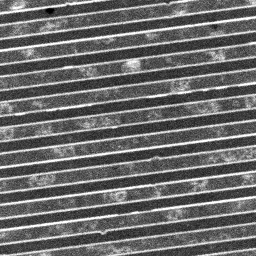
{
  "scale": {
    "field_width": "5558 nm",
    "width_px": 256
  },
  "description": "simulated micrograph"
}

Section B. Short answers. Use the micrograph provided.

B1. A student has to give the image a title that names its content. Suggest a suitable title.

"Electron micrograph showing parallel lines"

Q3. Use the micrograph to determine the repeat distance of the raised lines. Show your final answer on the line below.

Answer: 553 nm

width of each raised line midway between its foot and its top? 304 nanometers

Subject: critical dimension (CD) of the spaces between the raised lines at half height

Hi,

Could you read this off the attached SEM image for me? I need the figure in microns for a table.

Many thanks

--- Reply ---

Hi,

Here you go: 0.248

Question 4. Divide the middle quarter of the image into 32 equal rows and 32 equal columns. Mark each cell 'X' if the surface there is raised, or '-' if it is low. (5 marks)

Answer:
-----XXXXXXXXXXXXXXXXXXXXXXXXX--
XXXXXXXXXXXXXXXXXXXXXX----------
XXXXXXXXXXXXXX------------------
XXXXXXX-------------------------
------------------------XXXXXXXX
----------------XXXXXXXXXXXXXXXX
---------XXXXXXXXXXXXXXXXXXXXXXX
-XXXXXXXXXXXXXXXXXXXXXXXXXX-----
XXXXXXXXXXXXXXXXXXX-------------
XXXXXXXXXXX---------------------
XXXX-----------------------XXXXX
-------------------XXXXXXXXXXXXX
------------XXXXXXXXXXXXXXXXXXXX
----XXXXXXXXXXXXXXXXXXXXXXXXX---
XXXXXXXXXXXXXXXXXXXXXX----------
XXXXXXXXXXXXXX------------------
XXXXXXX-----------------------XX
----------------------XXXXXXXXXX
---------------XXXXXXXXXXXXXXXXX
-------XXXXXXXXXXXXXXXXXXXXXXXXX
XXXXXXXXXXXXXXXXXXXXXXXXX-------
XXXXXXXXXXXXXXXXX---------------
XXXXXXXXXX----------------------
XX--------------------XX-XXXXXXX
------------------XXXXXXXXXXXXXX
----------XXXXXXXXXXXXXXXXXXXXXX
--XXXXXXXXXXXXXXXXXXXXXXXXXX----
XXXXXXXXXXXXXXXXXXXX------------
XXXXXXXXXXXXX-------------------
XXXXX-----------------------XXXX
--------------------XXXXXXXXXXXX
-------------XXXXXXXXXXXXXXXXXXX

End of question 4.